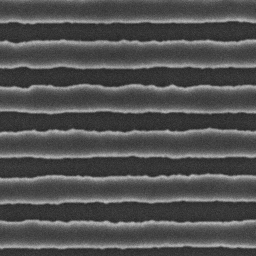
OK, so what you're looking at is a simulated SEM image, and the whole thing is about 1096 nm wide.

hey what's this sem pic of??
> lines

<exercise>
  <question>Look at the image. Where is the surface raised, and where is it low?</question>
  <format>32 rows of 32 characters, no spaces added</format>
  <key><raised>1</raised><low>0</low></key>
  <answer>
11111111111111111111111111111111
11111111111111111111111111111111
11111111111111111111111111111111
00000000000000000000000000000000
00000000000000000000000000000000
11111111111111111111111111111111
11111111111111111111111111111111
11111111111111111111111111111111
00001100001110111100000000000000
00000000000000000000000000000000
00000000000000000000000000000000
11111111111111111111111111111111
11111111111111111111111111111111
11111111111111111111111111111111
00000000000000000000000000000000
00000000000000000000000000000000
00011011111100001111110111111111
11111111111111111111111111111111
11111111111111111111111111111111
11111111111111110111111111111111
00000000000000000000000000000000
00000000000000000000000000000000
11111111111111111111111111111111
11111111111111111111111111111111
11111111111111111111111111111111
00000000000000000000000000000000
00000000000000000000000000000000
00000000000000000000000000000000
11111111111111111111111111111111
11111111111111111111111111111111
11111111111111111111111111111111
00000000000000000000000000000000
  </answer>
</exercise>